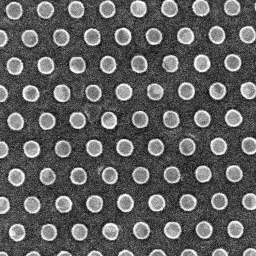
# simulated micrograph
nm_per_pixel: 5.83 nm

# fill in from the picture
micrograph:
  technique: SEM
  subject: a regular array of raised bodies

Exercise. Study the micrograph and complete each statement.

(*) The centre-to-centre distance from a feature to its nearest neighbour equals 181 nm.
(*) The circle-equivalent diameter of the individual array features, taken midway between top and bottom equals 91.6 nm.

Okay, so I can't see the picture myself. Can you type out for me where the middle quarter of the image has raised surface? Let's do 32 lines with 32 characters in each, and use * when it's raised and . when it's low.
..***....****....***.....***....
..***.....***....***......**....
................................
................................
................................
......**......**.....***.....***
*.....***....****....****....***
*.....***....****....****....***
*.....***.....**......**......**
................................
................................
................................
..**......**......**.....***....
..***....****....****....****...
..***....****....****....****...
..***.....***.....**......**....
................................
................................
................................
*.....***.....***.....**.....***
*.....***....****....****....***
**....***....****....****....***
*......**.....**......**......**
................................
................................
................................
..***.....***.....***.....**....
..***.....***....****....****...
..***.....***....****....****...
..***.....***.....**......**....
................................
................................